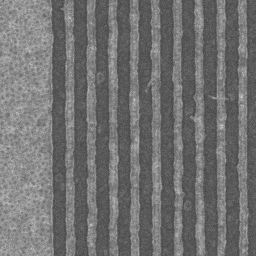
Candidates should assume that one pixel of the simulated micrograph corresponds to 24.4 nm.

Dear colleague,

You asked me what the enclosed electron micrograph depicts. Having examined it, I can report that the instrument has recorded parallel lines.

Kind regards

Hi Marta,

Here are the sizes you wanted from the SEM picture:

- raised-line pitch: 527 nm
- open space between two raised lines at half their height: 347 nanometers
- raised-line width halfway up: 0.183 µm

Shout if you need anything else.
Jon